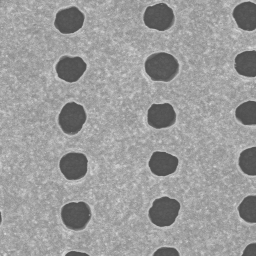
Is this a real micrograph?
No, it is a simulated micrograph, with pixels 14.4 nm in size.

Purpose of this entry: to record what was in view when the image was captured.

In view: a regular array of holes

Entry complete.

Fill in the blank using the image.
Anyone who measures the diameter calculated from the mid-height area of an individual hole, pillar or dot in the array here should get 28.4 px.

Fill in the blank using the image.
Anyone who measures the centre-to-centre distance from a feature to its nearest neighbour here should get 0.696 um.